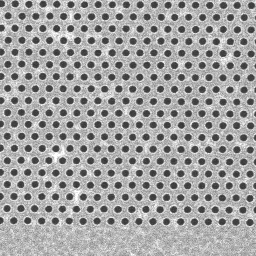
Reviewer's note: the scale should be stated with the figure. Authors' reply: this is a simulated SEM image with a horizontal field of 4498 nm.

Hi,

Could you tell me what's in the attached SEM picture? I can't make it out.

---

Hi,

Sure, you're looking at a regular array of holes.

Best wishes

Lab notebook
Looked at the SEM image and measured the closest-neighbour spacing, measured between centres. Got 0.238 micrometres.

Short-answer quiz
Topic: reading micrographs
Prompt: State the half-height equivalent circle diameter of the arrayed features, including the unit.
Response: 127 nm